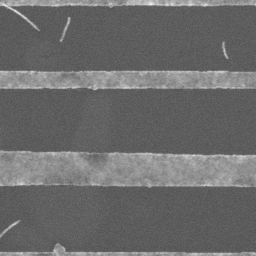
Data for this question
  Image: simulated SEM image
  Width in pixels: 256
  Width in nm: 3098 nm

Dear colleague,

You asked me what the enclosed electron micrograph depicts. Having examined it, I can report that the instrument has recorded lines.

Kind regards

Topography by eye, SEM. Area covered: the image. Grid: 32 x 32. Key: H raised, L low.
HHHHHHHHHHHHHHHHHHHHHHHHHHHHHHHH
LLLLLLLLLLLLLLLLLLLLLLLLLLLLLLLL
LLLLLLLLLLLLLLLLLLLLLLLLLLLLLLLL
LLLLLLLLLLLLLLLLLLLLLLLLLLLLLLLL
LLLLLLLLLLLLLLLLLLLLLLLLLLLLLLLL
LLLLLLLLLLLLLLLLLLLLLLLLLLLLLLLL
LLLLLLLLLLLLLLLLLLLLLLLLLLLLLLLL
LLLLLLLLLLLLLLLLLLLLLLLLLLLLLLLL
LLLLLLLLLLLLLLLLLLLLLLLLLLLLLLLL
HHHHHHHHHHHHHHHHHHHHHHHHHHHHHHHH
HHHHHHHHHHHHHHHHHHHHHHHHHHHHHHHH
LLLLLLLLLLLLLLLLLLLLLLLLLLLLLLLL
LLLLLLLLLLLLLLLLLLLLLLLLLLLLLLLL
LLLLLLLLLLLLLLLLLLLLLLLLLLLLLLLL
LLLLLLLLLLLLLLLLLLLLLLLLLLLLLLLL
LLLLLLLLLLLLLLLLLLLLLLLLLLLLLLLL
LLLLLLLLLLLLLLLLLLLLLLLLLLLLLLLL
LLLLLLLLLLLLLLLLLLLLLLLLLLLLLLLL
LLLLLLLLLLLLLLLLLLLLLLLLLLLLLLLL
HHHHHHHHHHHHHHHHHHHHHHHHHHHHHHHH
HHHHHHHHHHHHHHHHHHHHHHHHHHHHHHHH
HHHHHHHHHHHHHHHHHHHHHHHHHHHHHHHH
HHHHHHHHHHHHHHHHHHHHHHHHHHHHHHHH
LLLLLLLLLLLLLLLLLLLLLLLLLLLLLLLL
LLLLLLLLLLLLLLLLLLLLLLLLLLLLLLLL
LLLLLLLLLLLLLLLLLLLLLLLLLLLLLLLL
LLLLLLLLLLLLLLLLLLLLLLLLLLLLLLLL
LLLLLLLLLLLLLLLLLLLLLLLLLLLLLLLL
LLLLLLLLLLLLLLLLLLLLLLLLLLLLLLLL
LLLLLLLLLLLLLLLLLLLLLLLLLLLLLLLL
LLLLLLLLLLLLLLLLLLLLLLLLLLLLLLLL
LLLLLLHHHLLLLLLLLLLLLLLLLLLLLLLL